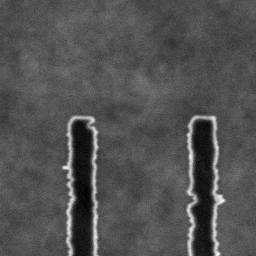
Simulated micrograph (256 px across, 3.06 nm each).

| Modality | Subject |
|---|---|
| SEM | one or a few lines or trenches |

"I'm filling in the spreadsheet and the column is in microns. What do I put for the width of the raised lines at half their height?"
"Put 0.0835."